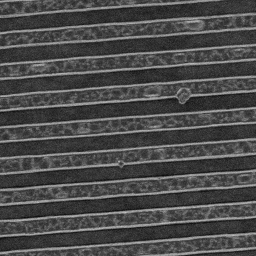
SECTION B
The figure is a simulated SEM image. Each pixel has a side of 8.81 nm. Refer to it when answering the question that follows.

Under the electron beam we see parallel lines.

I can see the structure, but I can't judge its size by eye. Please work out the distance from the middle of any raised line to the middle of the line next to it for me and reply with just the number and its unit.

276 nm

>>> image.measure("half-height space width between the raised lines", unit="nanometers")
147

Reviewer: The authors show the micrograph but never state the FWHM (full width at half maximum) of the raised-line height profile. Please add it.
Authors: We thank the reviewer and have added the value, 0.13 µm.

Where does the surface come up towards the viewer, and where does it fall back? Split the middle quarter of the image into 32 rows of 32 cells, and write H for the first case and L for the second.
HHHHHHHHHHHHHHHHHHHHHHHHHHLLLLLL
HHHHHHHHHHHHLLLLLLLLLLLLLLLLLLLL
LLLLLLLLLLLLLLLLLLLLLLLLLLLLLLLL
LLLLLLLLLLLLLLLLLLLLLLLLLLLLLLLL
LLLLLLLLLLLLLLLLLLLLLLLLLLLLLLLH
LLLLLLLLLLLLLLLLLLHHHHHHHHHHHHHH
LLLLLHHHHHHHHHHHHHHHHHHHHHHHHHHH
HHHHHHHHHHHHHHHHHHHHHHHHHHHHHHHH
HHHHHHHHHHHHHHHHHHHHHHHLLLLLHHHL
HHHHHHHHLLLLLLLLLLLLLLLLLLLLLHLL
LLLLLLLLLLLLLLLLLLLLLLLLLLLLLLLL
LLLLLLLLLLLLLLLLLLLLLLLLLLLLLLLL
LLLLLLLLLLLLLLLLLLLLLLLLLLLLLHHL
LLLLLLLLLLLLLLLLHHHHHHHHHHHHHHHH
LLLHHHHHHHHHHHHHHHHHHHHHHHHHHHHH
HHHHHHHHHHHHHHHHHHHHHHHHHHHHHHHH
HHHHHHHHHHHHHHHHHHHHLHLLLLLLLLLL
HHHHHHHHHHLLLLLLLLLLLLLLLLLLLLLL
LLLLLLLLLLLLLLLLLLLLLLLLLLLLLLLL
LLLLLLLLLLLLLLLLLLLLLLLLLLLLLLLL
LLLLLLLLLLLLLLLLLLLLLLLLLLLHHHHH
LLLLLLLLLLLLLLLHHHHHHHHHLHHHHHHH
LHHHHHHHHHHHHHHHHHHHHHHHLHHHHHHH
HHHHHHHHHHHHHHHHHHHHHHHHHHHHHHHH
HHHHHHHHHHHHHHHHHHLLLLLLLLLLLLLL
HHHHHLLLLLLLLLHLLLLLLLLLLLLLLLLL
LLLLLLLLLLLLLLLLLLLLLLLLLLLLLLLL
LLLLLLLLLLLLLLLLLLLLLLLLLLLLLLLL
LLLLLLLLLLLLLLLLLLLLLLLLLLHHHHHH
LLLLLLLLLLLLLHHHHHHHHHHHHHHHHHHL
HHHHHHHHHHHHHHHHHHHHHHHHHHHHHHHH
HHHHHHHHHHHHHHHHHHHHHHHHHHHHHLLL